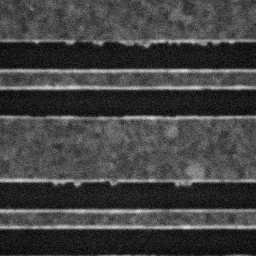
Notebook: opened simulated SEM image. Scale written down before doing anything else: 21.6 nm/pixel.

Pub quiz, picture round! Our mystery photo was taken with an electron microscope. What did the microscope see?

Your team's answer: lines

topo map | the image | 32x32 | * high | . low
********************************
********************************
********************************
********************************
********************************
................................
................................
................................
................................
********************************
********************************
................................
................................
................................
................................
********************************
********************************
********************************
********************************
********************************
********************************
********************************
********************************
................................
................................
................................
********************************
********************************
................................
................................
................................
................................